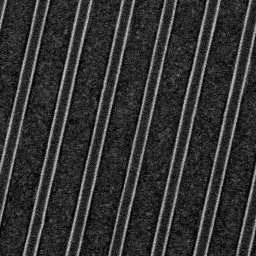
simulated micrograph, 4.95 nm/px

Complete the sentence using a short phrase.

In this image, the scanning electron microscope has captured parallel lines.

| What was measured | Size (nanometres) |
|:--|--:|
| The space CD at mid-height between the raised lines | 146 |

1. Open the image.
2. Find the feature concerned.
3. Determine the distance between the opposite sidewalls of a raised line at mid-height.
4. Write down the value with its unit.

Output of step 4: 59.8 nm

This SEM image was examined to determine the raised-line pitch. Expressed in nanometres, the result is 206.